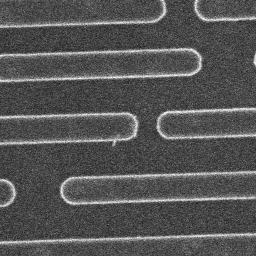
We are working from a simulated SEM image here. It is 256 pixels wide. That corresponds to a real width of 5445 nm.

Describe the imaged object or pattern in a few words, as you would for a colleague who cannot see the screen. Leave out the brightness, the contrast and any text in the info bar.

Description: parallel lines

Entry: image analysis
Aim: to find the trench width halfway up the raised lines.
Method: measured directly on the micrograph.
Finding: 765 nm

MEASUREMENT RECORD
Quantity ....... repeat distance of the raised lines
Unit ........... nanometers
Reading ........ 1320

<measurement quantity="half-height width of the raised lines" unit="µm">0.563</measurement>